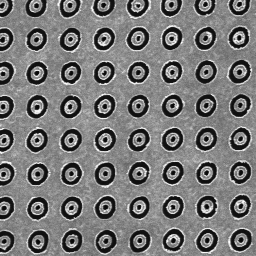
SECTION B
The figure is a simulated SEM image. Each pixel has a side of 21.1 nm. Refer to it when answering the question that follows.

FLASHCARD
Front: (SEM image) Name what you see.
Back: a regular array of ring-shaped grooves with a dot in the middle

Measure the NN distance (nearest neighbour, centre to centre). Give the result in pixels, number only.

33.2